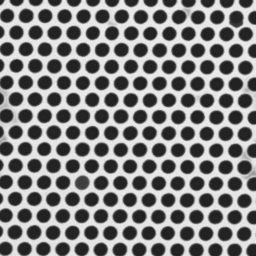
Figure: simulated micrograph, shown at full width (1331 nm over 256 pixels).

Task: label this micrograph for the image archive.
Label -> a regular array of holes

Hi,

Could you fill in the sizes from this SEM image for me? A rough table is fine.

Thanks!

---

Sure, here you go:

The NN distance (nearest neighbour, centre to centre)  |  18.9 px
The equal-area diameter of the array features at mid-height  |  0.0706 um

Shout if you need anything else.